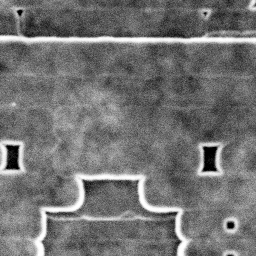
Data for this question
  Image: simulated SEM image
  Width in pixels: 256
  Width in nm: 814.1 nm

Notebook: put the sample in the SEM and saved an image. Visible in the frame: wiring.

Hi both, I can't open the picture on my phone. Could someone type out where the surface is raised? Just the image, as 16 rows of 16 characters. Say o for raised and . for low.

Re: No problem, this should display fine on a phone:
................
................
oooooooooooooooo
oooooooooooooooo
oooooooooooooooo
oooooooooooooooo
oooooooooooooooo
oooooooooooooooo
oooooooooooooooo
.ooooooooooooooo
oooooooooooooooo
ooooo....ooooooo
ooooo....ooooooo
ooo........ooooo
ooo........ooooo
ooo........ooooo